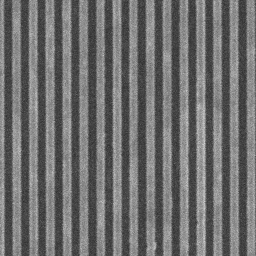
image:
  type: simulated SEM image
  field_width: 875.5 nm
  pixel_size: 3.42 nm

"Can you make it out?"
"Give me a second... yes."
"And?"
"parallel lines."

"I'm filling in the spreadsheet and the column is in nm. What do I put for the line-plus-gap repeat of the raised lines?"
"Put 57.2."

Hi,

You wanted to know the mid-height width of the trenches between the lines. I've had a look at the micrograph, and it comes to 31.2 nm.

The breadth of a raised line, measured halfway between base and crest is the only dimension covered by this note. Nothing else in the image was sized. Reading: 25.2 nanometres